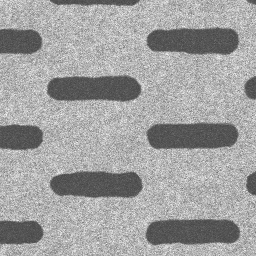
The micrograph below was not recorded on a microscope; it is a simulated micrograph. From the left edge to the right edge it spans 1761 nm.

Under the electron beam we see holes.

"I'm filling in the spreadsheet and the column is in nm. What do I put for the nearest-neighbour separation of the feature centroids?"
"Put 658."